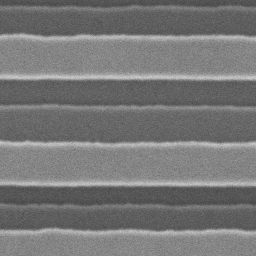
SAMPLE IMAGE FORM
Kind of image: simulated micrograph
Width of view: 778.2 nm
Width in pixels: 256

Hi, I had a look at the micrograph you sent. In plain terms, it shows lines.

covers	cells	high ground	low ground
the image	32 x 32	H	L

LLLLLLLLLLLLLLLLLLLLLLLLLLLLLLLL
LLLLLLLLLLLLLLLLLLLLLLLLLLLLLLLL
LLLLLLLLLLLLLLLLLLLLLLLLLLLLLLLL
LLLLLLLLLLLLLLLLLLLLLLLLLLLLLLLL
HHHHLLLLLLHHLHHHLLLLLLLLLLHHLLLL
HHHHHHHHHHHHHHHHHHHHHHHHHHHHHHHH
HHHHHHHHHHHHHHHHHHHHHHHHHHHHHHHH
HHHHHHHHHHHHHHHHHHHHHHHHHHHHHHHH
HHHHHHHHHHHHHHHHHHHHHHHHHHHHHHHH
HHHHHHHHHHHHHHHHHHHHHHHHHHHHHHHH
LLLLLLLLLLLLLLLLLLLLLLLLLLLLLLLL
LLLLLLLLLLLLLLLLLLLLLLLLLLLLLLLL
LLLLLLLLLLLLLLLLLLLLLLLLLLLLLLLL
LLLLLLLLLLLLLLLLLLLLLLLLLLLLLLLL
LLLLLLLLLLLLLLLLLLLLLLLLLLLLLLLL
LLLLLLLLLLLLLLLLLLLLLLLLLLLLLLLL
LLLLLLLLLLLLLLLLLLLLLLLLLLLLLLLL
LLLLLLLLLLLLLLLLLLLLLLLLLLLLLLLL
HHHHHHHHHHHHHHHHHHHHHHHHHHHHHHHH
HHHHHHHHHHHHHHHHHHHHHHHHHHHHHHHH
HHHHHHHHHHHHHHHHHHHHHHHHHHHHHHHH
HHHHHHHHHHHHHHHHHHHHHHHHHHHHHHHH
HHHHHHHHHHHHHHHHHHHHHHHHHHHHHHHH
LLLLLLLLLLLLLLLLLLLLLLLLLLLLLLLL
LLLLLLLLLLLLLLLLLLLLLLLLLLLLLLLL
LLLLLLLLLLLLLLLLLLLLLLLLLLLLLLLL
LLLLLLLLLLLLLLLLLLLLLLLLLLLLLLLL
LLLLLLLLLLLLLLLLLLLLLLLLLLLLLLLL
LLLLLLLLLLLLLLLLLLLLLLLLLLLLLLLL
HHHHHHHHHHHHHHHHHHHHHHHHHHHHHHHH
HHHHHHHHHHHHHHHHHHHHHHHHHHHHHHHH
HHHHHHHHHHHHHHHHHHHHHHHHHHHHHHHH